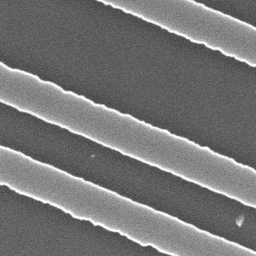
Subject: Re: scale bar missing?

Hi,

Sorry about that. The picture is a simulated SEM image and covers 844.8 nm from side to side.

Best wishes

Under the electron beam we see lines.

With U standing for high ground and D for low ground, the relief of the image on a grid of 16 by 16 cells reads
DDDDDDDUUUUUUDDD
DDDDDDDDDDUUUUUD
DDDDDDDDDDDDUUUU
DDDDDDDDDDDDDDUU
UDDDDDDDDDDDDDDD
UUUUDDDDDDDDDDDD
UUUUUUDDDDDDDDDD
DDDUUUUUUDDDDDDD
DDDDDUUUUUUDDDDD
UDDDDDDDUUUUUDDD
UUUDDDDDDDUUUUUU
UUUUUUDDDDDDUUUU
DDUUUUUUDDDDDDDU
DDDDDUUUUUUDDDDD
DDDDDDDUUUUUUDDD
DDDDDDDDDDUUUUUD